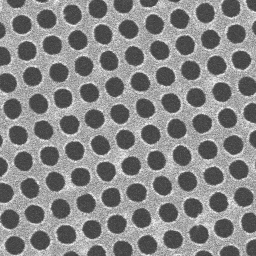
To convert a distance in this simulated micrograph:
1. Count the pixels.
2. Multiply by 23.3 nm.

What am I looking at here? a regular array of holes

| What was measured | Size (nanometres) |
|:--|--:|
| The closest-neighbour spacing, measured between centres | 600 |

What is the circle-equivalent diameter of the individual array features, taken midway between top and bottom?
0.466 micrometres